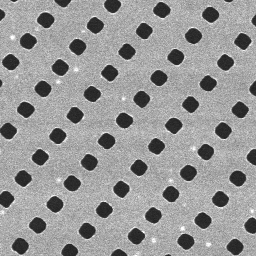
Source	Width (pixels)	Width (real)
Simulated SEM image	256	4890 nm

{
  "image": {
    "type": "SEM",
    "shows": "a regular array of holes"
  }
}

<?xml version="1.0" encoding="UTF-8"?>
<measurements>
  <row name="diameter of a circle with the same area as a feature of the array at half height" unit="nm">309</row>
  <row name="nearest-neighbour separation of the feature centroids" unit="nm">517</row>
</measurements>